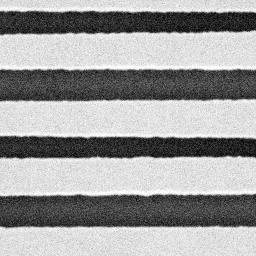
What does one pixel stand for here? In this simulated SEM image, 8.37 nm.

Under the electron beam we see lines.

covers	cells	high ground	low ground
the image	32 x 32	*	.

********************************
................................
................................
................................
********************************
********************************
********************************
********************************
.************.****.*****..******
................................
................................
................................
................................
********************************
********************************
********************************
********************************
................................
................................
................................
********************************
********************************
********************************
********************************
................................
................................
................................
................................
********************************
********************************
********************************
********************************